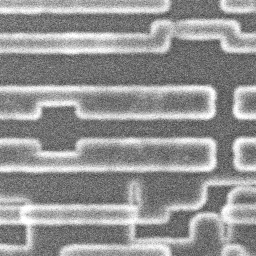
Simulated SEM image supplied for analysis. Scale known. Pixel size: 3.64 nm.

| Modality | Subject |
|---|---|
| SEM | wiring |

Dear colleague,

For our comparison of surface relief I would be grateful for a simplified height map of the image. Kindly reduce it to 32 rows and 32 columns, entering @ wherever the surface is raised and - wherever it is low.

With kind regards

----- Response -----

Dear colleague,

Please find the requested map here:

@@@@@@@@@@@@@@@@@@@@@-------@@@@
--------------------------------
--------------------------------
-------------------@@@@@@@@@@@--
@@@@@@@@@@@@@@@@@@@@@-@@@@@@@@@@
@@@@@@@@@@@@@@@@@@@@@-------@@@@
---@@@-@@@--@@------------------
--------------------------------
--------------------------------
--------------------------------
--------------------------------
@@@@@@@@@@@@@@@@@@@@@@@@@@@---@@
@@@@@@@@@@@@@@@@@@@@@@@@@@@--@@@
@@@@@-----@@@@@@@@@@@@@@@@@--@@@
@@@@@-----@@@@@@@@@@@@@@@@----@@
--------------------------------
--------------------------------
---------------@@@@@@@@@@@----@@
@@@@@-----@@@@@@@@@@@@@@@@@--@@@
@@@@@@@@@@@@@@@@@@@@@@@@@@@--@@@
@@@@@@@@@@@@@@@@@@@@@@@@@@@--@@@
--------------------------------
--------------------------------
--------------------------------
--------------------------------
--------------------------------
---@@@@@@@@@@@@@@-----------@@@@
---@@@@@@@@@@@@@@------------@@@
--------------------------------
--------------------------------
--------------------------------
--------@@@@@@@@@@@@@-------@@--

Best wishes